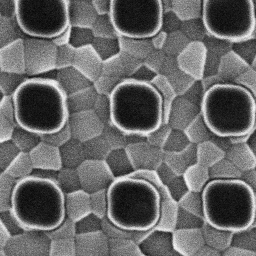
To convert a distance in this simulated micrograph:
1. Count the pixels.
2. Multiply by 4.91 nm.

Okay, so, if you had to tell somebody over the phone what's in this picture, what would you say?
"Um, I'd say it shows raised bodies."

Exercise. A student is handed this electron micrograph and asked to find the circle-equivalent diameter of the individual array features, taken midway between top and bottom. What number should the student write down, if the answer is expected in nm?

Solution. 261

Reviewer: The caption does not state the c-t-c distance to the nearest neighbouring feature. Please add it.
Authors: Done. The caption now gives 465 nanometres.